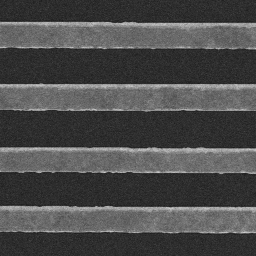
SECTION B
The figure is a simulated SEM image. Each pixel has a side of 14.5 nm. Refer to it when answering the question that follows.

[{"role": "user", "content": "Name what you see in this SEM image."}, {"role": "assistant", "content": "lines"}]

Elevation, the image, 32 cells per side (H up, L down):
LLLLLLLLLLLLLLLLLLLLLLLLLLLLLLLL
LLLLLLLLLLLLLLLLLLLLLLLLLLLLLLLL
LLLLLLLLLLLLLLLLLLLLLLLLLLLLLLLL
HHHHHHHHHHHHHHHHHHHHHHHHHHHHHHHH
HHHHHHHHHHHHHHHHHHHHHHHHHHHHHHHH
HHHHHHHHHHHHHHHHHHHHHHHHHHHHHHHH
LLLLLLLLLLLLLLLLLLLLLLLLLLLLLLLL
LLLLLLLLLLLLLLLLLLLLLLLLLLLLLLLL
LLLLLLLLLLLLLLLLLLLLLLLLLLLLLLLL
LLLLLLLLLLLLLLLLLLLLLLLLLLLLLLLL
LLLLLLLLLLLLLLLLLLLLLLLLLLLLLLLL
HHHHHHHHHHHHHHHHHHHHHHHHHHHHHHHH
HHHHHHHHHHHHHHHHHHHHHHHHHHHHHHHH
HHHHHHHHHHHHHHHHHHHHHHHHHHHHHHHH
LLLLLLLLLLLLLLLLLLLLLLLLLLLLLLLL
LLLLLLLLLLLLLLLLLLLLLLLLLLLLLLLL
LLLLLLLLLLLLLLLLLLLLLLLLLLLLLLLL
LLLLLLLLLLLLLLLLLLLLLLLLLLLLLLLL
LLLLLLLLLLLLLLLLLLLLLLLLLLLLLLLL
HHHHHHHHHHHHHHHHHHHHHHHHHHHHHHHH
HHHHHHHHHHHHHHHHHHHHHHHHHHHHHHHH
LLHLHHHLLLHHHHHHHHHHHHHHHHHHHHHH
LLLLLLLLLLLLLLLLLLLLLLLLLLLLLLLL
LLLLLLLLLLLLLLLLLLLLLLLLLLLLLLLL
LLLLLLLLLLLLLLLLLLLLLLLLLLLLLLLL
LLLLLLLLLLLLLLLLLLLLLLLLLLLLLLLL
HHHHHHHHHHHHHHHHHHHHHHHHHHHHHHHH
HHHHHHHHHHHHHHHHHHHHHHHHHHHHHHHH
HHHHHHHHHHHHHHHHHHHHHHHHHHHHHHHH
LLLLLLLLLLLLLLLLLLLLLLLLLLLLLLLL
LLLLLLLLLLLLLLLLLLLLLLLLLLLLLLLL
LLLLLLLLLLLLLLLLLLLLLLLLLLLLLLLL